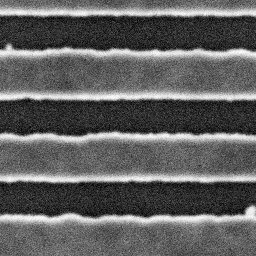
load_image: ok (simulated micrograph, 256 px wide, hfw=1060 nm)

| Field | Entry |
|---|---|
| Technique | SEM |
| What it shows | lines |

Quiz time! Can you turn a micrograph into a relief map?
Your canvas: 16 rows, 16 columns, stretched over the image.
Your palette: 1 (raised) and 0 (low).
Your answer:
1111111111111111
0000000000000000
0000000000000000
1111111111111111
1111111111111111
1111111111111111
0000000000000000
0000000000000000
1011011111111110
1111111111111111
1111111111111111
0000000000000000
0000000000000000
1000100000000000
1111111111111111
1111111111111111